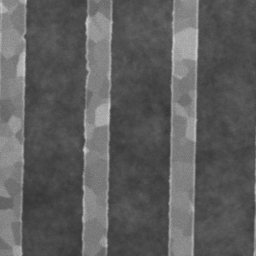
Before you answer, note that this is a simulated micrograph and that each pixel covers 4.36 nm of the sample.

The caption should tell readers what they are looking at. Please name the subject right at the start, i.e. one or a few lines or trenches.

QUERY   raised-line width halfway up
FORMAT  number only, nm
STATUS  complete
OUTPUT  102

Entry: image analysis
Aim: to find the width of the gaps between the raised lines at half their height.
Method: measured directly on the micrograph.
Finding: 0.273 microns